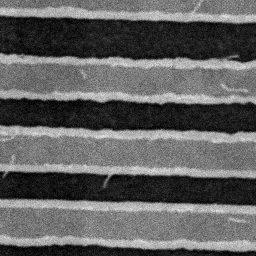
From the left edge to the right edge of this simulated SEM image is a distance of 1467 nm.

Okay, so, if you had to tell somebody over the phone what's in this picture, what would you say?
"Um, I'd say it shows one or a few lines or trenches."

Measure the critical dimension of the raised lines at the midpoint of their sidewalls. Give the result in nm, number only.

224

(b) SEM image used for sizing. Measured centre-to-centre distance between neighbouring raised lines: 415 nm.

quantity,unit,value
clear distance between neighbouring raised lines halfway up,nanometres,196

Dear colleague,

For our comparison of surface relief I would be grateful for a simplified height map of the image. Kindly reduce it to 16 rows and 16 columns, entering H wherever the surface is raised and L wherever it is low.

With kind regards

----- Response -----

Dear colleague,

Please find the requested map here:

HHHHHHHHHHHHHHHH
LLLLLLLLLLLLLLLL
LLLLLLLLLLLLLLLL
LLLLLLLLLLLLLLLL
HHHHHHHHHHHHHHHH
HHHHHHHHHHHHHHHH
LLLLLLLLLLLLLLLL
LLLLLLLLLLLLLLLL
HHHHHHHHHHHHHHLH
HHHHHHHHHHHHHHHH
HHHHHHHHHHHHHHHH
LLLLLLLLLLLLLLLL
LLLLLLLLLLLLLLLL
HHHHHHHHHHHHHHHH
HHHHHHHHHHHHHHHH
LLLLLLLLLLLLLLHH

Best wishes